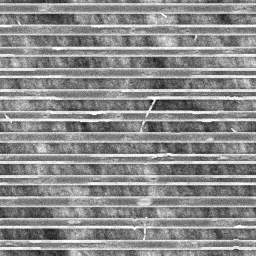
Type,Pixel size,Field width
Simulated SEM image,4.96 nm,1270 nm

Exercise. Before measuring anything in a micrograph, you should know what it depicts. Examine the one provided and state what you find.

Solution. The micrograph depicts parallel lines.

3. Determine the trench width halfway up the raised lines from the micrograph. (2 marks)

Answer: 57.1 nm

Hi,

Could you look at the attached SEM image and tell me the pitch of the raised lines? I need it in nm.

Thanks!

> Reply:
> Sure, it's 107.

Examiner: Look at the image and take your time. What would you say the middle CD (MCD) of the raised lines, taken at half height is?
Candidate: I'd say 9.76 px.